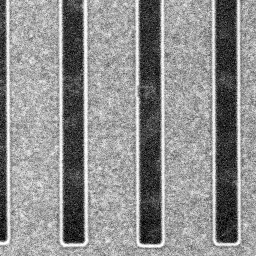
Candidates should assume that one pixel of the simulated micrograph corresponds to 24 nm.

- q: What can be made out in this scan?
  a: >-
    one or a few lines or trenches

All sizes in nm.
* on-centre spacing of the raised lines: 1850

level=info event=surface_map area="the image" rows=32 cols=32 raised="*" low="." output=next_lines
.******....******...*******...**
.******....******...*******...**
.*******...******...*******...**
.*******...******...*******...**
.*******...******...*******...**
.*******...******...*******...**
.*******...******...*******...**
.*******...******...*******...**
.*******...******...*******...**
.*******...******...*******...**
.*******...******...*******...**
.*******...******...*******...**
.*******...******...*******...**
.*******...******...*******...**
.*******...******...*******...**
.*******...******...*******...**
.*******...******...*******...**
.*******...******...*******...**
.*******...******...*******...**
.*******...******...*******...**
.*******...******...*******...**
.*******...******...*******...**
.*******...******...*******...**
.*******...******...*******...**
.*******...******...*******...**
.*******...******...*******...**
.*******...******...*******...**
.*******...******...*******...**
.*******...******...*******...**
.*******...******...*******...**
********..********..********.***
********************************